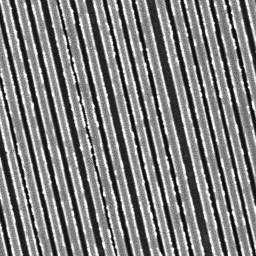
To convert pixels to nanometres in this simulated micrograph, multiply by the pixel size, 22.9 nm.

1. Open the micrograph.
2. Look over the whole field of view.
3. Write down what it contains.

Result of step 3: parallel lines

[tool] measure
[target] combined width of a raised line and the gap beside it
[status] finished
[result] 341 nm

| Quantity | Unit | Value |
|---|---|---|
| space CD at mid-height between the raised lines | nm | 126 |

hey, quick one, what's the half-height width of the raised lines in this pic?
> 0.212 microns